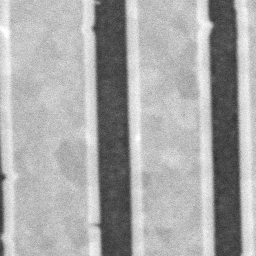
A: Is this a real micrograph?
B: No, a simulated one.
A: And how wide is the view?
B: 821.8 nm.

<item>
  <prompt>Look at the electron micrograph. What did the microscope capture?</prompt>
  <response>one or a few lines or trenches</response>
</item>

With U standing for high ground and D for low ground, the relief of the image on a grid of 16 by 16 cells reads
UUUUUUDDUUUUUDDU
UUUUUDDDUUUUUDDU
UUUUUUDDUUUUUDDU
UUUUUUDDUUUUUDDU
UUUUUUDDUUUUUDDU
UUUUUUDDUUUUUDDU
UUUUUUDDUUUUUDDU
UUUUUUDDUUUUUDDU
UUUUUUDDDUUUUDDU
UUUUUUDDDUUUUDDU
DUUUUUDDDUUUUDDU
DUUUUUDDDUUUUDDU
DUUUUUDDDUUUUDDU
DUUUUUDDDUUUUDDU
UUUUUUDDDUUUUDDD
DUUUUUDDDUUUUDDD